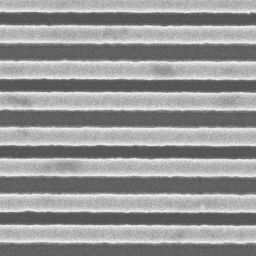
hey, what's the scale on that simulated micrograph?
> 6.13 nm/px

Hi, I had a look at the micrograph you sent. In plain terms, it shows parallel lines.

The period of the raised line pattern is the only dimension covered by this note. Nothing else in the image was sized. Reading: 204 nm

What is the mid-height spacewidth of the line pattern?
72.8 nanometres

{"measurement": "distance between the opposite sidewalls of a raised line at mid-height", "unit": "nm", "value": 120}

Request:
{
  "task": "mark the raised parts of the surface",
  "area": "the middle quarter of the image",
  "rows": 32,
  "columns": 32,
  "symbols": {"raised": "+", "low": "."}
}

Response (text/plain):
++++++++++++++++++++++++++++++++
++++++++++++++++++++++++++++++++
++++++++++++++++++++++++++++++++
++++++++++++++++++++++++++++++++
................................
................................
................................
++++++++++++++++++++++++++++++++
++++++++++++++++++++++++++++++++
++++++++++++++++++++++++++++++++
++++++++++++++++++++++++++++++++
+++++++++++.++.+++++++++..++++++
................................
................................
................................
................................
++++++++++++++++++++++++++++++++
++++++++++++++++++++++++++++++++
++++++++++++++++++++++++++++++++
++++++++++++++++++++++++++++++++
++++++++...++++++++++++++...++.+
................................
................................
.............++..+.........++...
++++++++++++++++++++++++++++++++
++++++++++++++++++++++++++++++++
++++++++++++++++++++++++++++++++
++++++++++++++++++++++++++++++++
................................
................................
................................
................................